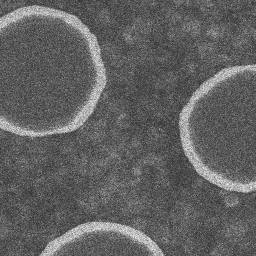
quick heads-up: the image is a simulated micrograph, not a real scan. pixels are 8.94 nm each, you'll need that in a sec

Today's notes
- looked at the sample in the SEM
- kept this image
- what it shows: raised bodies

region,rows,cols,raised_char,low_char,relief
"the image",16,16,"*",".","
................
*****...........
******..........
******..........
******........**
******.......***
******......****
*****.......****
............****
............****
............****
..............**
................
................
.....***........
...*******......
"